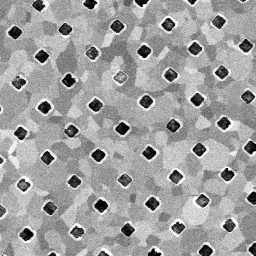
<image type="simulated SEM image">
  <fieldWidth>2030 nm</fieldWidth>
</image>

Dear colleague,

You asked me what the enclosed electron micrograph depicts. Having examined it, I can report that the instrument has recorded a regular array of holes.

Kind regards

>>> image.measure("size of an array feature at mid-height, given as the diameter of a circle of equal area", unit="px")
12.7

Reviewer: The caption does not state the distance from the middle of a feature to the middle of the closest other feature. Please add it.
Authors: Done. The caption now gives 0.283 um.